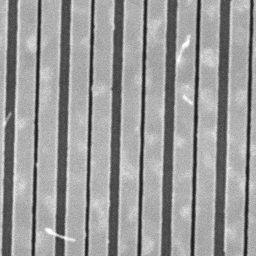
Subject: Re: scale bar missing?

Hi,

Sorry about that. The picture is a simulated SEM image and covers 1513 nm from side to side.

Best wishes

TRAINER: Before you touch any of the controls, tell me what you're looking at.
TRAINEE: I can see parallel lines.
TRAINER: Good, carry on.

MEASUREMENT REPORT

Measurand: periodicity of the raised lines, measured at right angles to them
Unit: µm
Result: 0.157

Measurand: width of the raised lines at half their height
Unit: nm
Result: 111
